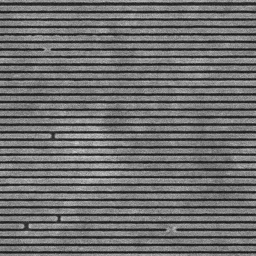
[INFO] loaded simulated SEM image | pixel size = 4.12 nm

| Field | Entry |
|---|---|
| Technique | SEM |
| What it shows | parallel lines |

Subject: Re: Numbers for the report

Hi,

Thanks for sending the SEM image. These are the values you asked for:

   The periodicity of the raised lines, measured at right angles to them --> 30.9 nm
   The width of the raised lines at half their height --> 0.0211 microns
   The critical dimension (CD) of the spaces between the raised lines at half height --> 10.8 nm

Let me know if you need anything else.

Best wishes